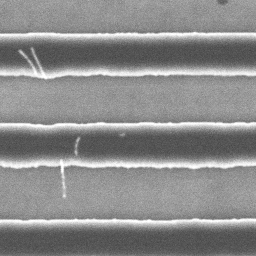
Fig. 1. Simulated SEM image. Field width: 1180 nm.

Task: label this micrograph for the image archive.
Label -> lines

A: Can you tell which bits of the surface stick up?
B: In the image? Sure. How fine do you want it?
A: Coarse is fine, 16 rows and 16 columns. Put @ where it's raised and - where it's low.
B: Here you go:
----------------
----------------
@@@@@@@@@@@@@@@@
@@@@@@@@@@@@@@@@
@@@@@@@@@@@@@@@@
----------------
----------------
----------------
@@@@@@@@@@@@@@@@
@@@@@@@@@@@@@@@@
----------------
----------------
----------------
----------------
@@@@@@@@@@@@@@@@
@@@@@@@@@@@@@@@@